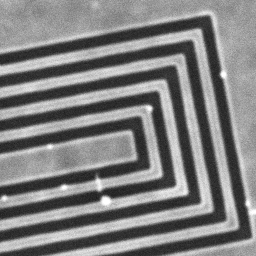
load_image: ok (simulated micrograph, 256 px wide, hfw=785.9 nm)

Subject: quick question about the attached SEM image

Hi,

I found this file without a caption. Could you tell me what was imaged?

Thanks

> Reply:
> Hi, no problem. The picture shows groups of lines, slits or small figures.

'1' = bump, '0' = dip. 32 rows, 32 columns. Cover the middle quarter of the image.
00000000000000111111111111001110
00000000111111111111000000001110
00011111111111000000000000000110
11111111110000000000000000000110
11111000000000000000011111000110
00000000000000000111111111000111
00000000000011111111110111000111
00000111111111111000000011000011
11111111111100000000000011000011
11111111000000000000000011100011
11000000000000000000100001100011
00000000000000111111110001100011
00000000111111111111110001100001
00011111111111100000110001100001
11111111110000000000110001110001
11111000000000000000110000110001
00000000000000000000110000110001
00000000000111111000111000110001
00000111111111111000011000110000
01111111111111111000011000110000
11111111111111111100011000011000
11111111111111111100011000011000
11111111111111111100011100011000
11111111111111111100011100011000
11111111111111100000001100011100
11111111110000000000001100011100
11111000000000000000011100001100
00000000000000000111111100001100
00000000000111111111111000001100
00000011111111111100000000001110
11111111111110000000000000001110
11111110100000000000000001111110